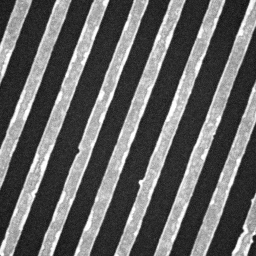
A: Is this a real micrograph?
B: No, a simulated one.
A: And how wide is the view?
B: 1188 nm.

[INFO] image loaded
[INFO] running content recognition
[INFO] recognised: parallel lines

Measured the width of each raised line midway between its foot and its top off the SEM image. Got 0.0618 µm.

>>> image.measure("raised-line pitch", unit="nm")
168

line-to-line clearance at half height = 110 nm